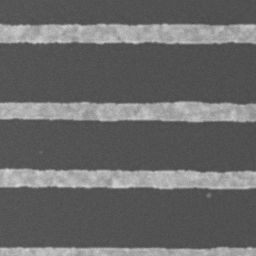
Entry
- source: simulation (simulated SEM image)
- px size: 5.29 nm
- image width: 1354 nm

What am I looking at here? lines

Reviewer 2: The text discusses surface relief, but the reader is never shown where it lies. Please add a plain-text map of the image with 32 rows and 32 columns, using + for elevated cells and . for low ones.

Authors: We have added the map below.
................................
................................
................................
++++++++++++++++++++++++++++++++
++++++++++++++++++++++++++++++++
................................
................................
................................
................................
................................
................................
................................
................................
++++++++++++++++++++++++++++++++
++++++++++++++++++++++++++++++++
................................
................................
................................
................................
................................
................................
+++++++++++++++++++++++++....+++
++++++++++++++++++++++++++++++++
....................+.....+++++.
................................
................................
................................
................................
................................
................................
................................
++++++++++++++++++++++++++++++++